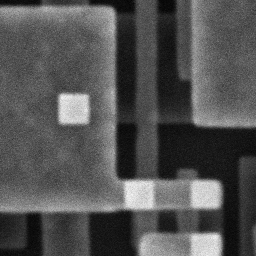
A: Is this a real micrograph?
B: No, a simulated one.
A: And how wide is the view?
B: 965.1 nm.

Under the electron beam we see wiring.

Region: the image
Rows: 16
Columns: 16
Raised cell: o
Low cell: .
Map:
ooooooo.....oooo
ooooooo.....oooo
ooooooo.....oooo
ooooooo.....oooo
ooooooo.....oooo
ooooooo.....oooo
ooooooo.....oooo
ooooooo.....oooo
ooooooo.........
ooooooo.........
ooooooo.........
oooooooooooooo..
oooooooooooooo..
................
................
.........ooooo..